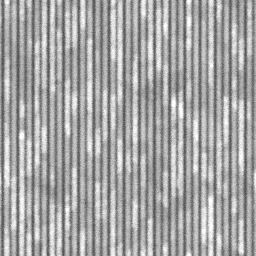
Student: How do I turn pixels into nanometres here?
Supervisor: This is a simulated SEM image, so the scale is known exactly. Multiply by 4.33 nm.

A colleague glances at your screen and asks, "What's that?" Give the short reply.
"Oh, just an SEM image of parallel lines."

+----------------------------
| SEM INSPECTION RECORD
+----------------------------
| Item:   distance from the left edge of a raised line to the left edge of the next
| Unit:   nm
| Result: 32.9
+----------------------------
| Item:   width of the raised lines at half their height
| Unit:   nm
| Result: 19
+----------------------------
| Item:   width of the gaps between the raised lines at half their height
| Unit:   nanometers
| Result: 11.9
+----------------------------